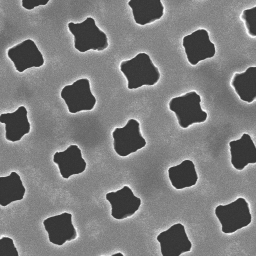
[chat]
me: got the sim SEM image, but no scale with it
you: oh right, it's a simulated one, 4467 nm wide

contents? a regular array of holes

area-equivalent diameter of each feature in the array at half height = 32 px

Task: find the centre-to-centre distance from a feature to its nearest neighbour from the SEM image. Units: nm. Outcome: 1100